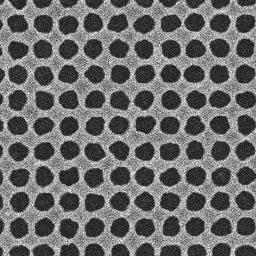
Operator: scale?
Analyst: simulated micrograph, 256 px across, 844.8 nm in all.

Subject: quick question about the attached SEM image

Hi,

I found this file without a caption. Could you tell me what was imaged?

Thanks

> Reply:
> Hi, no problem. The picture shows a regular array of holes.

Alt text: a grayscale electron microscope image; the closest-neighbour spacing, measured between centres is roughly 81.2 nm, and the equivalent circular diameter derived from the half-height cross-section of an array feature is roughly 63.4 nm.